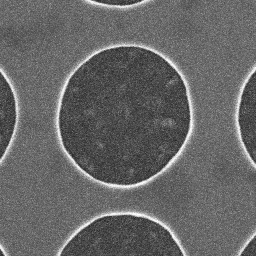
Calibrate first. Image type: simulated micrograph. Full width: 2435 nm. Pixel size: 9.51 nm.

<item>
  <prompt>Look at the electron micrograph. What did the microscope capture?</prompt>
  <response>holes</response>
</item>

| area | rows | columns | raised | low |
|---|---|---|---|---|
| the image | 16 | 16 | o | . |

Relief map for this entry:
oooooooooooooooo
oooooooooooooooo
oooooooooooooooo
oooooo....oooooo
ooooo......ooooo
.ooo........ooo.
.ooo........ooo.
.ooo........ooo.
.ooo........ooo.
oooo.......oooo.
ooooo.....oooooo
ooooooo..ooooooo
oooooooooooooooo
ooooooo..ooooooo
ooooo......ooooo
oooo.......oooo.